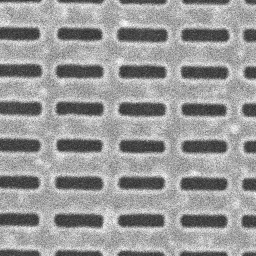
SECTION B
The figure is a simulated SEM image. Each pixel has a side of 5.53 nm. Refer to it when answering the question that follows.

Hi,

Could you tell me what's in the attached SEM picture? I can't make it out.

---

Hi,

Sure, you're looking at a regular array of holes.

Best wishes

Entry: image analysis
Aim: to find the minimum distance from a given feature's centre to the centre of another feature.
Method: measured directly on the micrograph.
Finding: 205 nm